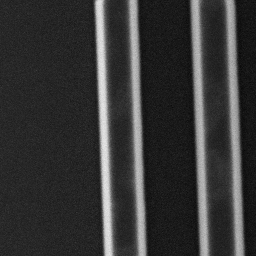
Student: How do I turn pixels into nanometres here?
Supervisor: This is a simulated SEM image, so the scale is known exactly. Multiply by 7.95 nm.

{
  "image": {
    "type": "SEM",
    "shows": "one or a few lines or trenches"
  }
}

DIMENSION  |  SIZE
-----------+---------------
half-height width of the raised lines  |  0.285 micrometres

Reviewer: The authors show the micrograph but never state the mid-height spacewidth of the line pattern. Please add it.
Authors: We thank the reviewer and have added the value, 0.488 um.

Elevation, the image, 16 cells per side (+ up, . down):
......++....++..
......++....++..
......++....++..
......++....+++.
......++....+++.
......+++...+++.
......+++...+++.
......+++...+++.
......+++....++.
.......++....++.
.......++....++.
.......++....++.
.......++....++.
.......++....++.
.......++....++.
.......++....++.